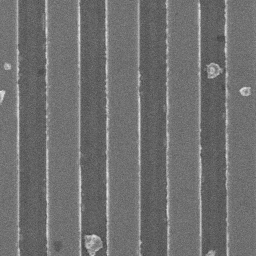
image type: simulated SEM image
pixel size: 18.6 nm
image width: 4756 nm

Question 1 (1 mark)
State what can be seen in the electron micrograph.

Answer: lines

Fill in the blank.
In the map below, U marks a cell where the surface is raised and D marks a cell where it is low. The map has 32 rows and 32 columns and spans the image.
UUDDDDUUUUDDDUUUUDDDDUUUUDDDUUUU
UUDDDDUUUUDDDUUUUDDDDUUUUDDDUUUU
UUDDDDUUUUDDDUUUUDDDDUUUUDDDUUUU
UUDDDDUUUUDDDUUUUDDDDUUUUDDDUUUU
UUDDDDUUUUDDDUUUUDDDDUUUUDDDUUUU
UUDDDDUUUUDDDUUUUDDDDUUUUDDDUUUU
UUDDDDUUUUDDDUUUUDDDDUUUUDDDUUUU
UUDDDDUUUUDDDUUUUDDDDUUUUDDDUUUU
UUDDDDUUUUDDDUUUUDDDDUUUUDDDUUUU
UUDDDDUUUUDDDUUUUDDDDUUUUDDDUUUU
UUDDDDUUUUDDDUUUUDDDDUUUUDDDUUUU
UUDDDDUUUUDDDUUUUDDDDUUUUDDDUUUU
UUDDDDUUUUDDDUUUUDDDDUUUUDDDUUUU
UUDDDDUUUUDDDUUUUDDDDUUUUDDDUUUU
UUDDDDUUUUDDDUUUUDDDDUUUUDDDUUUU
UUDDDDUUUUDDDUUUUDDDDUUUUDDDUUUU
UUDDDDUUUUDDDUUUUDDDDUUUUDDDUUUU
UUDDDDUUUUDDDUUUUDDDDUUUUDDDUUUU
UUDDDDUUUUDDDUUUUDDDDUUUUDDDUUUU
UUDDDDUUUUDDDUUUUDDDDUUUUDDDUUUU
UUDDDDUUUUDDDUUUUDDDDUUUUDDDUUUU
UUDDDDUUUUDDDUUUUDDDDUUUUDDDUUUU
UUDDDDUUUUDDDUUUUDDDDUUUUDDDUUUU
UUDDDDUUUUDDDUUUUDDDDUUUUDDDUUUU
UUDDDDUUUUDDDUUUUDDDDUUUUDDDUUUU
UUDDDDUUUUDDDUUUUDDDDUUUUDDDUUUU
UUDDDDUUUUDDDUUUUDDDDUUUUDDDUUUU
UUDDDDUUUUDDDUUUUDDDDUUUUDDDUUUU
UUDDDDUUUUDDDUUUUDDDDUUUUDDDUUUU
UUDDDDUUUUDDDUUUUDDDDUUUUDDDUUUU
UUDDDDUUUUDUDUUUUUDDDUUUUDDDUUUU
UUDDDDUUUUDDDUUUUDDDDUUUUDDDUUUU